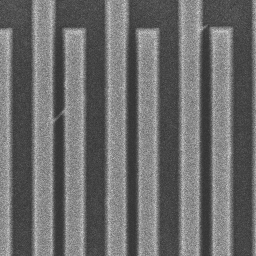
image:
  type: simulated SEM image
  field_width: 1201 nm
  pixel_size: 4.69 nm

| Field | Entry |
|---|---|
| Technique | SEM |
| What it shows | parallel lines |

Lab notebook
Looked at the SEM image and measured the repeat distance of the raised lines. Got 0.167 um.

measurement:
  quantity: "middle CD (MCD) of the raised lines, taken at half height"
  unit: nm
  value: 100